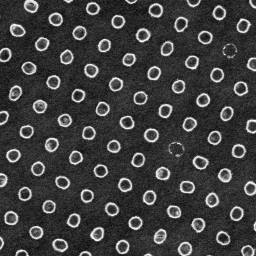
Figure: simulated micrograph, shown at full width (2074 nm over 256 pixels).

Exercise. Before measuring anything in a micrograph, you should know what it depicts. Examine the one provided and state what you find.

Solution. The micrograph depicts a regular array of raised bodies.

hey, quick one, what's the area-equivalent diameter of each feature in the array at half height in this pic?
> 103 nanometres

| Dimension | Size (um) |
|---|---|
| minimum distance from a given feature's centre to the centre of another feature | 0.223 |